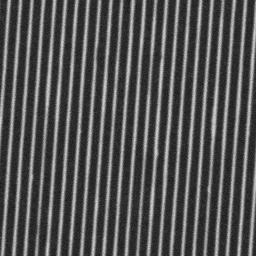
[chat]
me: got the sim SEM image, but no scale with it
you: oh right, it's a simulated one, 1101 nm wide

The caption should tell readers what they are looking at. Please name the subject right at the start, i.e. parallel lines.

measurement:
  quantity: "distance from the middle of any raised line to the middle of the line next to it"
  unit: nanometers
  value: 48.3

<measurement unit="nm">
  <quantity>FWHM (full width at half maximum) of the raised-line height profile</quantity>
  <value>11.2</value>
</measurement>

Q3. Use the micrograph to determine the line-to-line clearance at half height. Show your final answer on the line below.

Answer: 37.5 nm